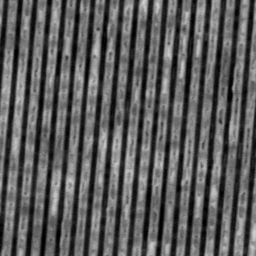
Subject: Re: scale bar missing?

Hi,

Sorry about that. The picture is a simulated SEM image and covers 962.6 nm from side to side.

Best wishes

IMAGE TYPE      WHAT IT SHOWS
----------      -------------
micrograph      parallel lines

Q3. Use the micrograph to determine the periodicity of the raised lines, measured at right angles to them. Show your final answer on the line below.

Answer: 54.2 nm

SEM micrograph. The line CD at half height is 33.2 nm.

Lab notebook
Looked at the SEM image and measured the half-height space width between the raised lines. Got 20.1 nm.